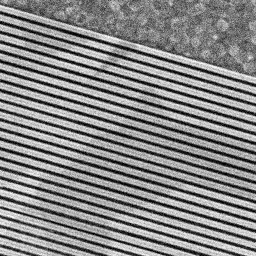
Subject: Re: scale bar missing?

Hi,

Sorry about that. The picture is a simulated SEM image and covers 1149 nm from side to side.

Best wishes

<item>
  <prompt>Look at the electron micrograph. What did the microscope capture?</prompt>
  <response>parallel lines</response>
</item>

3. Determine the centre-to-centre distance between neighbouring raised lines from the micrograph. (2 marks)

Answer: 0.0419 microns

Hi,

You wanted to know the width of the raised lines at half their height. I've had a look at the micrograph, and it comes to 21 nm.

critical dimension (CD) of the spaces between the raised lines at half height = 21 nm